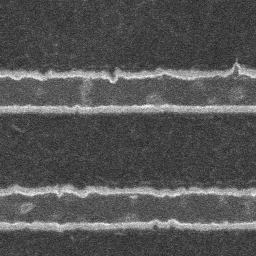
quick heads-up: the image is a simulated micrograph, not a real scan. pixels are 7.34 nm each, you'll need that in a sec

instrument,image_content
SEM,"one or a few lines or trenches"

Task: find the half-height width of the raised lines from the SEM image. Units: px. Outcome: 35.5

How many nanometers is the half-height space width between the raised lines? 595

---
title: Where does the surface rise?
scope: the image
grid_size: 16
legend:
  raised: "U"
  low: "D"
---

DDDDDDDDDDDDDDDD
DDDDDDDDDDDDDDDD
DDDDDDDDDDDDDDDD
DDDDDDDDDDDDDDDD
DDDDDDDDDDUDDDUU
UUUUUUUUUUUUUUUU
UUUUUUUUUUUUUUUU
DDDDDDDDDDDDDDDD
DDDDDDDDDDDDDDDD
DDDDDDDDDDDDDDDD
DDDDDDDDDDDDDDDD
DDDDDDDDDDDDDDDD
UUUUUUUUUUUUUUUU
UUUUUUUUUUUUUUUU
DDDDDDDDDDDDDDDD
DDDDDDDDDDDDDDDD